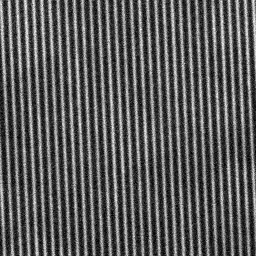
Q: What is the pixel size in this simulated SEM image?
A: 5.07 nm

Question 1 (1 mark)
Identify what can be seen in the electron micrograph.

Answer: parallel lines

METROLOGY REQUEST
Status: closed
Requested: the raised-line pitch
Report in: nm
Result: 41.3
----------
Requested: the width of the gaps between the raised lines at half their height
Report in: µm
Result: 0.031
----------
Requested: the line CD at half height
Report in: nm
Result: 8.9